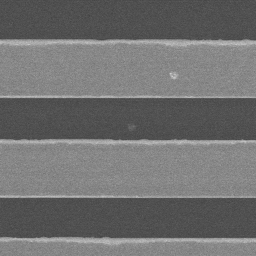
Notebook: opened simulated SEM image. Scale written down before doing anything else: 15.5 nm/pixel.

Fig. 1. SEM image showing lines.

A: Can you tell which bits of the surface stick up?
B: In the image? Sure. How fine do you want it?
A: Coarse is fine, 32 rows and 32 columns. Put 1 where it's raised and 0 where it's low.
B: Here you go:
00000000000000000000000000000000
00000000000000000000000000000000
00000000000000000000000000000000
00000000000000000000000000000000
00000000000000000000000000000000
11111111111111111111111111111111
11111111111111111111111111111111
11111111111111111111111111111111
11111111111111111111111111111111
11111111111111111111111111111111
11111111111111111111111111111111
11111111111111111111111111111111
00000000000000000000000000000000
00000000000000000000000000000000
00000000000000000000000000000000
00000000000000000000000000000000
00000000000000000000000000000000
10000011100000000000000000000000
11111111111111111111111111111111
11111111111111111111111111111111
11111111111111111111111111111111
11111111111111111111111111111111
11111111111111111111111111111111
11111111111111111111111111111111
11111111111111111111111111111111
00000000000000000000000000000000
00000000000000000000000000000000
00000000000000000000000000000000
00000000000000000000000000000000
00000000000000000000000000000000
11111111111111111111111111111111
11111111111111111111111111111111